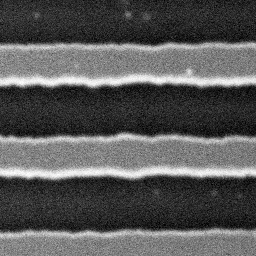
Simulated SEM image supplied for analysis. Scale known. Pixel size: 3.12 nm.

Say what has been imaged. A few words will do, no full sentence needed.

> lines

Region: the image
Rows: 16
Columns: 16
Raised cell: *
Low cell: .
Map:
................
................
................
****************
****************
................
................
................
.......**.*.....
****************
****************
................
................
................
.**..*.*********
****************